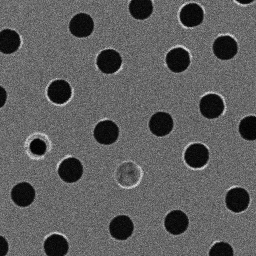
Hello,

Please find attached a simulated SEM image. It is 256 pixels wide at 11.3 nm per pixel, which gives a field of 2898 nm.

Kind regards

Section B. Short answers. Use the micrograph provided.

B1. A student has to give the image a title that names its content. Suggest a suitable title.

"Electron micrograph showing a regular array of holes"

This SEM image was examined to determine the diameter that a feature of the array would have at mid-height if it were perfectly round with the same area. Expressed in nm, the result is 282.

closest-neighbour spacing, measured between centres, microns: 0.584